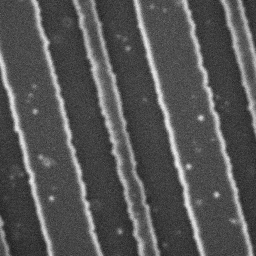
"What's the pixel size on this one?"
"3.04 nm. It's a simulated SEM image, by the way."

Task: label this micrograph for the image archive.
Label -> lines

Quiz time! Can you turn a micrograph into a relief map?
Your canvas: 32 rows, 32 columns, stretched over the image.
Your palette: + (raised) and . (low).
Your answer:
+++++....+++.....++++++.....++..
+++++.....++.....+++++++....+++.
+++++.....++.....+++++++....+++.
+++++.....+++.....++++++.....++.
++++++.....++.....++++++.....++.
++++++.....++.....+++++++....++.
++++++.....++.....+++++++.....++
++++++.....+++.....++++++.....++
+++++++.....++.....++++++.....++
+++++++.....++.....+++++++....++
.++++++.....++......++++++.....+
.++++++.....+++.....++++++.....+
.+++++++.....++.....+++++++....+
.+++++++.....++.....+++++++....+
..++++++.....++......++++++.....
..++++++.....+++.....++++++.....
..+++++++.....++.....++++++.....
..+++++++.....++.....+++++++....
...++++++.....++......++++++....
...++++++.....+++.....++++++....
...+++++++.....++.....+++++++...
....++++++.....++.....+++++++...
....++++++.....++......++++++...
....+++++++.....++.....++++++...
....+++++++.....++.....+++++++..
.....++++++.....++.....+++++++..
.....++++++.....+++.....++++++..
.....++++++......++.....+++++++.
.....+++++++.....++.....+++++++.
......++++++.....++.....+++++++.
+.....++++++.....+++.....++++++.
+.....+++++++....+++.....+++++++